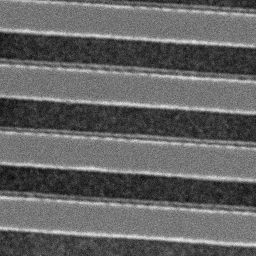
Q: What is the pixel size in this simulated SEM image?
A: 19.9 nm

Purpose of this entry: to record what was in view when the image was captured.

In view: lines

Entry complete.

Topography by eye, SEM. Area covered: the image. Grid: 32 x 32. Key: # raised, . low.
###################.............
################################
################################
################################
...........#####################
...........................#####
................................
................................
###############.................
###############################.
################################
################################
......##########################
.....................###########
................................
................................
########........................
########################........
################################
################################
.###############################
................################
................................
................................
#######.........................
######################..........
################################
################################
################################
...............#################
..............................##
................................